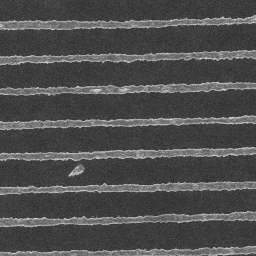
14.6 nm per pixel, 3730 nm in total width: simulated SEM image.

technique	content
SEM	parallel lines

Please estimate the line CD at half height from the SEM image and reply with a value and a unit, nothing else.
104 nm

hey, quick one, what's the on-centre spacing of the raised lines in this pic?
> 477 nanometres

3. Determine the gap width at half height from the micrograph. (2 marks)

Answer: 0.377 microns